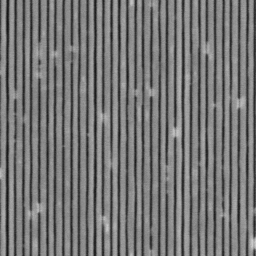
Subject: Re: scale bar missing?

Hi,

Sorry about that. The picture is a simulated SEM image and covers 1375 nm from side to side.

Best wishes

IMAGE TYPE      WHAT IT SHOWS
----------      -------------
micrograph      parallel lines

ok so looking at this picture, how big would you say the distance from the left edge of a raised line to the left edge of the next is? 42.8 nm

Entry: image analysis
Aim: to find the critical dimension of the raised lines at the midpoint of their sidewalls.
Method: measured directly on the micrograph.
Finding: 34.2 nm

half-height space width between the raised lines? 10.1 nm